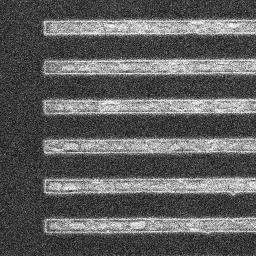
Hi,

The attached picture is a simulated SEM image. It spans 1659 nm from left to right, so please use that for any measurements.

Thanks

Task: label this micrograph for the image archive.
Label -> parallel lines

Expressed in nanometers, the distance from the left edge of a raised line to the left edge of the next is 257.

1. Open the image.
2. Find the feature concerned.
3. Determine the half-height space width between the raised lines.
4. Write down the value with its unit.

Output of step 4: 0.0729 microns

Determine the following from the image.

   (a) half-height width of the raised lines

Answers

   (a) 28.1 px